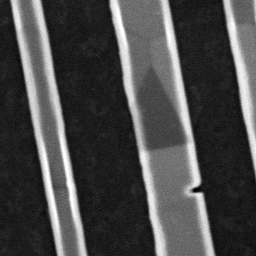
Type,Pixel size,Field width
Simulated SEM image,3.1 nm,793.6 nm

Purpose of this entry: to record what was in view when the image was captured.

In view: one or a few lines or trenches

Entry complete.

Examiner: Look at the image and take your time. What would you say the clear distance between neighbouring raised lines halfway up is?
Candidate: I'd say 72.9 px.